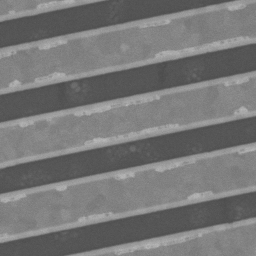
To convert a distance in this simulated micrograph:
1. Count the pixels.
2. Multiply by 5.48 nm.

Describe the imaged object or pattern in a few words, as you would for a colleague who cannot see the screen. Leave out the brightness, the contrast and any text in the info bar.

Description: one or a few lines or trenches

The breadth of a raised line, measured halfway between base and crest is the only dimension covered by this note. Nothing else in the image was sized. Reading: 219 nm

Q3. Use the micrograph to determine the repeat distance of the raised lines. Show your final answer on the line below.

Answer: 395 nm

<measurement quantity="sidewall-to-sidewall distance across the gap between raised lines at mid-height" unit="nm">169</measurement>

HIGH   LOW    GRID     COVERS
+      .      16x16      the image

+++..........+++
........++++++++
...+++++++++++++
+++++++++++.....
++++++..........
+...........++++
.......+++++++++
..++++++++++++..
+++++++++.......
++++..........++
.........+++++++
....++++++++++++
++++++++++++....
+++++++.........
+++.........++++
.......+++++++++